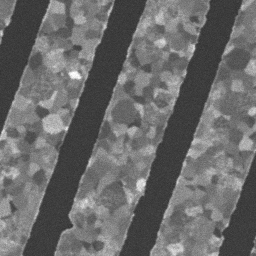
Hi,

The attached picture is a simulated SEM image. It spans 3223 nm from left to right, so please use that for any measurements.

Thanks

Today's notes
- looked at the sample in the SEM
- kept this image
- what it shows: one or a few lines or trenches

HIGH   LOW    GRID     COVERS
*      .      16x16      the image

*..****..****..*
...****..****..*
..****..****..**
..****..****..**
..****..****..**
.****..****..***
.****..****..***
****..*****..***
****..****..****
****..****..****
***..****..*****
***..****..****.
***..****..****.
**..****..****..
**..****..****..
*...****..****..